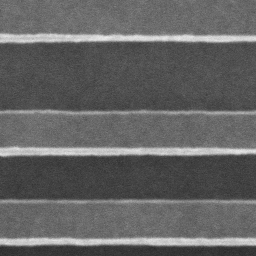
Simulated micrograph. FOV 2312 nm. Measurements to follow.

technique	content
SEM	lines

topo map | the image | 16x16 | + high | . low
++++++++++++++++
++++++++++++++++
++++++++++++++++
................
................
................
................
++++++++++++++++
++++++++++++++++
++++++++++++++++
................
................
................
++++++++++++++++
++++++++++++++++
................